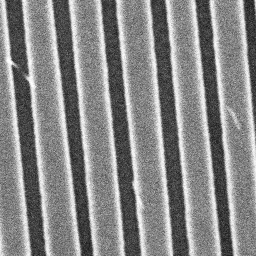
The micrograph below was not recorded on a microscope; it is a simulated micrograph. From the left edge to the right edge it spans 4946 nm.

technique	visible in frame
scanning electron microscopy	lines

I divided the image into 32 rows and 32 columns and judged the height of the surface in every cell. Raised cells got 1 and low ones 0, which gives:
10011110011110011110011100111100
10011110011110011110011100111100
10011110011110011110011110011110
10011110011110011110011110011110
10011110011110011110011110011110
10011110011110011110011110011110
10011110011110011110011110011110
10001110011110011110011110011110
10001110011110011111001110011110
11001111001110011111001110011110
11001111001111001111001110011110
11001111001111001111001110011110
11001111001111001111001111011110
11001111001111001111001111001110
11001111001111001111001111001111
11001111001111001111001111001111
11001111001111001111001111001111
11001111001111001111001111001111
11000111101111001111001111001111
11100111100111001111100111001111
11100111100111100111100111001111
11100111100111100111100111101111
11100111100111100111100111101111
11100111100111100111100111101111
11100111100111100111100111100111
11100111100111100111100111100111
11100111100111100111100111100111
11100111110111100111100111100111
11100111110111100111100111100111
11110011110111100111100111100111
11110011110011100011100011110111
11110011110011110011110011110111